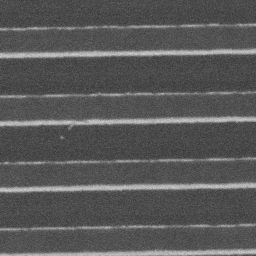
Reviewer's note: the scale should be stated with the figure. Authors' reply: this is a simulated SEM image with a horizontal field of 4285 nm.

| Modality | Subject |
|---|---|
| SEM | lines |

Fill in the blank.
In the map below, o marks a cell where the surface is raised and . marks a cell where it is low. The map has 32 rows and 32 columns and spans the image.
................................
................................
................................
..........oooooooooooooooooooooo
oooooooooooooooooooooooooooooooo
oooooooooooooooooooooooooooooooo
ooooooooooooooooooooooooooo.....
................................
................................
................................
................................
................................
oooooooooooooooooooooooooooooooo
oooooooooooooooooooooooooooooooo
oooooooooooooooooooooooooooooooo
o...............................
................................
................................
................................
................................
oooooooooooooooooooooooooooooooo
oooooooooooooooooooooooooooooooo
oooooooooooooooooooooooooooooooo
oooooooooo......................
................................
................................
................................
................................
..........oooooooooooooooooooooo
oooooooooooooooooooooooooooooooo
oooooooooooooooooooooooooooooooo
oooooooooooooooooooooooooooooo..